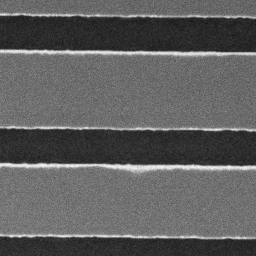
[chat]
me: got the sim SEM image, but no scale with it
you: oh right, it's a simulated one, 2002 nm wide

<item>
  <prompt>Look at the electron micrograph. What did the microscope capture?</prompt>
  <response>lines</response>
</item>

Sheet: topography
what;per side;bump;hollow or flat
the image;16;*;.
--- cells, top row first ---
****************
................
................
****************
****************
****************
****************
****************
................
................
****************
****************
****************
****************
****************
................